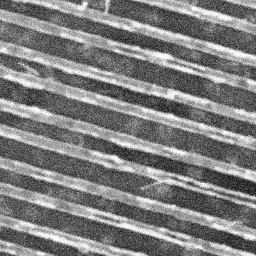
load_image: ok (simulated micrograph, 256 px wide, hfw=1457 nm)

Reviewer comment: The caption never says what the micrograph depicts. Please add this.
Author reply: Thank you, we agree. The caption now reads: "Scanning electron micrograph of parallel lines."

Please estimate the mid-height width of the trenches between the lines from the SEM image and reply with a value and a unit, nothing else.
93.1 nm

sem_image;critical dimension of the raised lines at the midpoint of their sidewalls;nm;54.8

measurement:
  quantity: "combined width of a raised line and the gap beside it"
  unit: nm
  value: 158